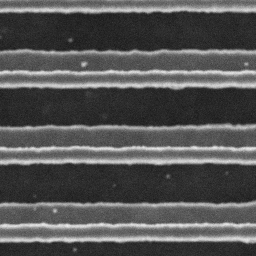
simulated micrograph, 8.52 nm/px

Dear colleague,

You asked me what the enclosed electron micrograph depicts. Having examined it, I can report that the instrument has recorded lines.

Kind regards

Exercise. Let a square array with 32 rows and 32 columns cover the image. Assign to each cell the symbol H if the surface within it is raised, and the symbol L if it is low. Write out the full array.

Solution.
HHHHHHHHHHHHHHHHHHHHHHHHHHHHHHHH
HLHLLLLLHLLHHLLLLHHLHLLLLHHLLLLL
LLLLLLLLLLLLLLLLLLLLLLLLLLLLLLLL
LLLLLLLLLLLLLLLLLLLLLLLLLLLLLLLL
LLLLLLLLLLLLLLLLLLLLLLLLLLLLLLLL
LLLLLLLLLLLLLLLLLLLLLLLLLLLLLLLL
HHHHHHHLHHHHHHHLHHHHHHHHHHHHHHHH
HHHHHHHHHHHHHHHHHHHHHHHHHHHHHHHH
HHHHHHHHHHHHHHHHHHHHHHHHHHHHHHHH
HHHHHHHHHHHHHHHHHHHHHHHHHHHHHHHH
HHHHHHHHHHHHHHHHHHHHHHHHHHHHHHHH
LLLLLLLLLLLLLLLLLLLLLLLLLLLLLLLL
LLLLLLLLLLLLLLLLLLLLLLLLLLLLLLLL
LLLLLLLLLLLLLLLLLLLLLLLLLLLLLLLL
LLLLLLLLLLLLLLLLLLLLLLLLLLLLLLLL
LLLLLLLLLLLLLLLLLLLLLLLLLLLLLLLL
HHHHHHHHHHHHHHHHHHHHHHHHHHHHHHHH
HHHHHHHHHHHHHHHHHHHHHHHHHHHHHHHH
HHHHHHHHHHHHHHHHHHHHHHHHHHHHHHHH
HHHHHHHHHHHHHHHHHHHHHHHHHHHHHHHH
HLHHLLLLLLLLLLLLLLLHLLLLLLLLLLLL
LLLLLLLLLLLLLLLLLLLLLLLLLLLLLLLL
LLLLLLLLLLLLLLLLLLLLLLLLLLLLLLLL
LLLLLLLLLLLLLLLLLLLLLLLLLLLLLLLL
LLLLLLLLLLLLLLLLLLLLLLLLLLLLLLLL
LLLLLHLHHLLLHLLLLLLLLLLLLLLLLLLH
HHHHHHHHHHHHHHHHHHHHHHHHHHHHHHHH
HHHHHHHHHHHHHHHHHHHHHHHHHHHHHHHH
HHHHHHHHHHHHHHHHHHHHHHHHHHHHHHHH
HHHHHHHHHHHHHHHHHHHHHHHHHHHHHHHH
LLLLLLLLLLLLLLLLLLLLLLLLLLLLLLLL
LLLLLLLLLLLLLLLLLLLLLLLLLLLLLLLL